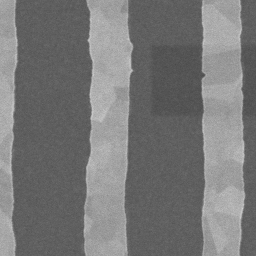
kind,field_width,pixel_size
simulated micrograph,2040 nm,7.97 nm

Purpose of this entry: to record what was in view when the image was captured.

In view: one or a few lines or trenches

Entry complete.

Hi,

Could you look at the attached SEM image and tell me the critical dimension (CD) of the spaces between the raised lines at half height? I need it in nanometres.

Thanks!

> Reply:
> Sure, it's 595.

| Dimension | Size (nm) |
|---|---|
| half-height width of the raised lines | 305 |